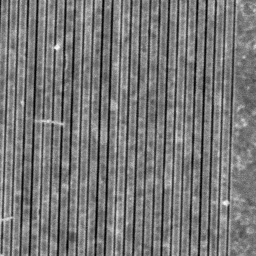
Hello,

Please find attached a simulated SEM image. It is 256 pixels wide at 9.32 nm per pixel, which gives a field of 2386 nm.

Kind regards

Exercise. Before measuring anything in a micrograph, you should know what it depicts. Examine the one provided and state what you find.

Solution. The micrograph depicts parallel lines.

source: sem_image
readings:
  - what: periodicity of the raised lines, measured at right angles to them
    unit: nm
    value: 87.5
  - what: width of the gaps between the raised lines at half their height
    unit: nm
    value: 25.6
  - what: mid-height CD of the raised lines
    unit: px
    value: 6.37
